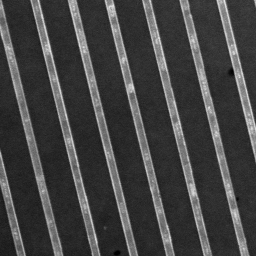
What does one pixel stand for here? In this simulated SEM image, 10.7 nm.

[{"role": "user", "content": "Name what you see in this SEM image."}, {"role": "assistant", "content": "parallel lines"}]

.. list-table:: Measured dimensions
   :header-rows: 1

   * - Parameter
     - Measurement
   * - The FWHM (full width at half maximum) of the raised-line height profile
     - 71.1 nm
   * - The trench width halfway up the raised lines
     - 314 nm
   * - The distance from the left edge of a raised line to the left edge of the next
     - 0.386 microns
